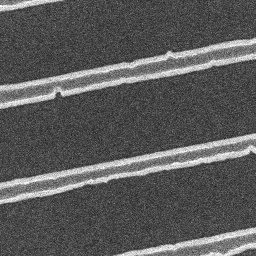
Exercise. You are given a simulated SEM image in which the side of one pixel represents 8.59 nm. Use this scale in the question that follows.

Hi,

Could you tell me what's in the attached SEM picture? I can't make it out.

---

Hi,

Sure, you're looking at one or a few lines or trenches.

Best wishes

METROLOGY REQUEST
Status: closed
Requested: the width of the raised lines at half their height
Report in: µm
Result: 0.14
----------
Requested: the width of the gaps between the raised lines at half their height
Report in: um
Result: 0.67